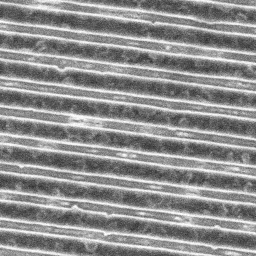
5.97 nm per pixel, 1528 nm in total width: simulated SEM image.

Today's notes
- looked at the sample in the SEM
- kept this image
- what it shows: parallel lines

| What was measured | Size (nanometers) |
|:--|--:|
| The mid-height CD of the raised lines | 114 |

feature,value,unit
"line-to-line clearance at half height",51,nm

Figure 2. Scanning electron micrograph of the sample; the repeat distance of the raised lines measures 27.9 pixels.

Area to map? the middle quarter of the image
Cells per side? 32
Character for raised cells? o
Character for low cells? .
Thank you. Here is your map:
...............ooooooooooooooooo
ooooo...................oooooooo
oooooooooooo..................oo
oooooooooooooooooooo.o..........
oooooooooooooooooooooooooooo....
oooooooooooooooooooooooooooooooo
.......ooooooooooooooooooooooooo
...............ooooooooooooooooo
ooooo..................ooooooooo
ooooooooooooo.................oo
oooooooooooooooooooo............
oooooooooooooooooooooooooo......
oooooooooooooooooooooooooooooooo
........oooooooooooooooooooooooo
...............ooooooooooooooooo
ooo....................ooooooooo
ooooooooooooo..................o
ooooooooooooooooooo.............
ooooooooooooooooooooooooooo.....
oooooooooooooooooooooooooooooooo
......oooooooooooooooooooooooooo
..............oooooooooooooooooo
oooo..................oooooooooo
ooooooooooo....................o
ooooooooooooooooooo.............
ooooooooooooooooooooooooo.......
oooooooooooooooooooooooooooooooo
.....ooooooooooooooooooooooooooo
..............oooooooooooooooooo
oooo..................oooooooooo
oooooooooo....................oo
ooooooooooooooooooo.............